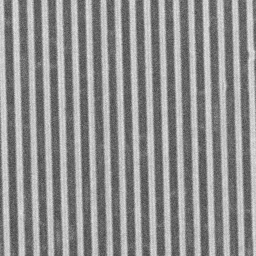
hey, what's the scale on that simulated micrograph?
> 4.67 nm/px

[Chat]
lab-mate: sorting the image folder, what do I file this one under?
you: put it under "parallel lines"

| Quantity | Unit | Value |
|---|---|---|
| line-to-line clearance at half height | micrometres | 0.049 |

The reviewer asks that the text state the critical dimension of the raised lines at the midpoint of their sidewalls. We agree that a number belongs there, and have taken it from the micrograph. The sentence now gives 0.0181 µm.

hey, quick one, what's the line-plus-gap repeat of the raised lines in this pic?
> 68.4 nm